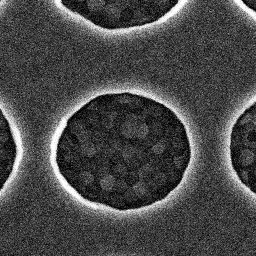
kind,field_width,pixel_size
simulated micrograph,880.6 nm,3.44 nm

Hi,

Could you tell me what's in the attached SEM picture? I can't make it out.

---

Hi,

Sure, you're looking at holes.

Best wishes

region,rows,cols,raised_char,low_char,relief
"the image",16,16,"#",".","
####.......#####
######...#######
################
################
################
################
#####.....######
####.......####.
.###........##..
.###........##..
.###........###.
####.......####.
#####.....######
################
################
################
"